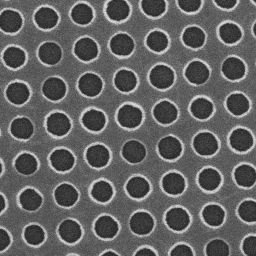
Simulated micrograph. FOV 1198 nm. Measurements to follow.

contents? a regular array of holes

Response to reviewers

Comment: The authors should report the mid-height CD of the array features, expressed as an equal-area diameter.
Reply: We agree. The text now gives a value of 23 pixels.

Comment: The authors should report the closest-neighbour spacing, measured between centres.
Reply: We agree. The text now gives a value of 166 nm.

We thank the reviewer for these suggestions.